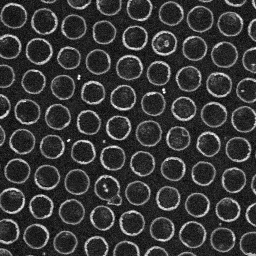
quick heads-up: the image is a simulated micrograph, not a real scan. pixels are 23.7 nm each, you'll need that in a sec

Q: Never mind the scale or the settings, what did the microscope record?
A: a regular array of raised bodies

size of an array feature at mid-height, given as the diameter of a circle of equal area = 562 nm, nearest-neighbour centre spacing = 0.71 µm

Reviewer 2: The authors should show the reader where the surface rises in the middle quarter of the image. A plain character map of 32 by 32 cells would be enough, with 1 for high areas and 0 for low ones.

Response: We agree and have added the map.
11100011111001111110001111000000
00000011111001111111011111000111
00000000000000111110011111001110
11000000000000011100011111001111
11000011000000000000001110001111
11100111100000100000000000000111
11000111110001111000000000000011
11000111110011111100011100000000
10000111110011111100111110000110
00000011100011111101111110001111
00000000000011111000111110011111
10000000000000000000111110011111
10001111000000000000011100011111
11001111100011110000000000001111
10011111100111110000110000000000
00001111100111111001111100000000
00001111000111111011011100011100
00000000000111110011111100111110
00000000000011100011111100111110
00011100000000000001111000111110
00111110000000000000000000111110
00111111001111000000000000000000
00111111011111100011100000000000
00111111011111100111110000110000
00001100011111100111110001111100
00000000001111000111110001111100
00010000000000000111110011111100
01111000000000000011100001111100
01111100011100000000000000111000
11111100111110000010000000000000
11111100111111001111100000000000
01111100111111001111100011110000